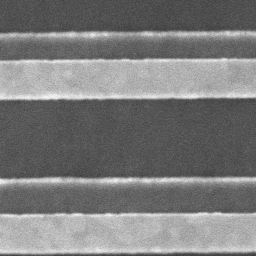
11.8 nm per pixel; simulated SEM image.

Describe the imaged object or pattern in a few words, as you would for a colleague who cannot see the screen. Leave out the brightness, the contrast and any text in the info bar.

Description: lines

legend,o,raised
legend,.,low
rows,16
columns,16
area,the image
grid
................
................
oooooooooooooooo
oooooooooooooooo
oooooooooooooooo
oooooooooooooooo
................
................
................
................
................
oooooooooooooooo
oooooooooooooooo
oooooooooooooooo
oooooooooooooooo
oooooooooooooooo